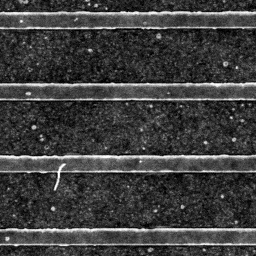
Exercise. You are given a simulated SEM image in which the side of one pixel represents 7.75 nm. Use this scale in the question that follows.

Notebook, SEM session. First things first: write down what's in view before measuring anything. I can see lines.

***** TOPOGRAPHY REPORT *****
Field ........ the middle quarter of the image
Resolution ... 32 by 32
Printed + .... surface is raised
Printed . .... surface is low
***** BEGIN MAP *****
................................
................................
................................
................................
................................
++++++++++++++++++++++++++++++++
++++++++++++++++++++++++++++++++
++++++++++++++++++++++++++++++++
++++++++++++++++++++++++++++++++
................................
................................
................................
................................
................................
................................
................................
................................
................................
................................
................................
................................
................................
................................
++++++++++++++++++++++++++++++++
++++++++++++++++++++++++++++++++
++++++++++++++++++++++++++++++++
++++++++++++++++++++++++++++++++
................................
................................
................................
................................
................................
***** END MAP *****